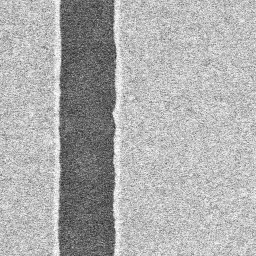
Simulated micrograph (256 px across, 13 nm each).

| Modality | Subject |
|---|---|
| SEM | one or a few lines or trenches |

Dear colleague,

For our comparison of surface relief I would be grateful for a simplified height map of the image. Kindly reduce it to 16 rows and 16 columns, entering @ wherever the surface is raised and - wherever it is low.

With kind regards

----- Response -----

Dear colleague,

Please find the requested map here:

@@@@---@@@@@@@@@
@@@@---@@@@@@@@@
@@@@---@@@@@@@@@
@@@@---@@@@@@@@@
@@@@---@@@@@@@@@
@@@@---@@@@@@@@@
@@@@---@@@@@@@@@
@@@@---@@@@@@@@@
@@@@---@@@@@@@@@
@@@@---@@@@@@@@@
@@@@---@@@@@@@@@
@@@@---@@@@@@@@@
@@@----@@@@@@@@@
@@@----@@@@@@@@@
@@@----@@@@@@@@@
@@@@---@@@@@@@@@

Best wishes